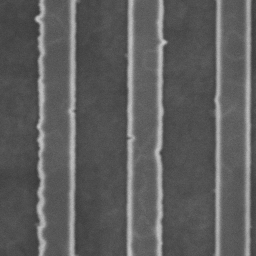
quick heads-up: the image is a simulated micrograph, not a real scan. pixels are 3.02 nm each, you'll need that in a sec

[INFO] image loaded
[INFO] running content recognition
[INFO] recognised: one or a few lines or trenches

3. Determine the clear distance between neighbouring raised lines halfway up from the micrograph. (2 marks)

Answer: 168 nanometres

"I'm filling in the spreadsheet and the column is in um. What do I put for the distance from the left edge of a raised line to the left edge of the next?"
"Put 0.266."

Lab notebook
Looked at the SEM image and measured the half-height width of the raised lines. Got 0.0969 micrometres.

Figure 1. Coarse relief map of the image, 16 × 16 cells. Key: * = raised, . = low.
...**...**....**
..***...**....**
...**...**....**
...**...**....**
...**...**....**
..***...**....**
...**...**....**
..***...**....**
..***...**....**
..***...**....**
..***...**....**
...**...**....**
...**...**....**
...**...**....**
..***...**....**
...**...**....**